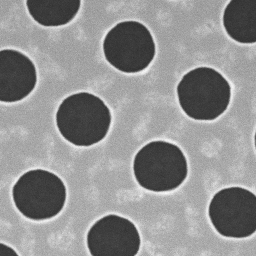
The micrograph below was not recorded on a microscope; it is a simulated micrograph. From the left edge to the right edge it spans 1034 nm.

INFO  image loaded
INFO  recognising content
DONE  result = holes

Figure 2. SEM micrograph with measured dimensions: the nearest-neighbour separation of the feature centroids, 346 nanometres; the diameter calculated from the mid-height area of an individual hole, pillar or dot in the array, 215 nanometres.